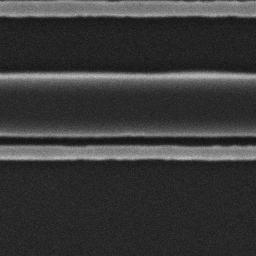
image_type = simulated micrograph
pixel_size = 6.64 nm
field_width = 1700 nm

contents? lines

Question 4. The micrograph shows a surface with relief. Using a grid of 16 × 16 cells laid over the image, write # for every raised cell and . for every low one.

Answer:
################
................
................
................
................
################
################
################
################
################
................
................
................
................
................
................